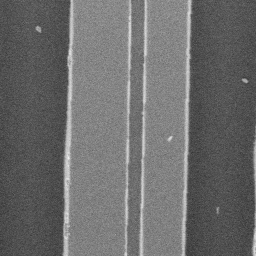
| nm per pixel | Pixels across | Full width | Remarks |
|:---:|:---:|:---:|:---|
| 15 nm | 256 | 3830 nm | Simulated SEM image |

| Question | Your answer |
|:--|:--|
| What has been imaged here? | lines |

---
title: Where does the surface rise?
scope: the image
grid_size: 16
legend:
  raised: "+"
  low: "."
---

.....+++++++....
.....+++++++....
....++++++++....
....++++++++....
....++++++++....
....++++++++....
....++++++++....
....++++++++....
....++++++++....
....++++++++....
....++++++++....
....++++++++....
....++++++++....
....+++++++.....
....+++++++.....
....+++++++.....